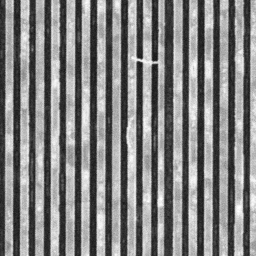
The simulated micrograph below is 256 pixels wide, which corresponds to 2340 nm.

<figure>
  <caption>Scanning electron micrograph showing parallel lines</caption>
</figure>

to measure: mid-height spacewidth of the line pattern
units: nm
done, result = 68.6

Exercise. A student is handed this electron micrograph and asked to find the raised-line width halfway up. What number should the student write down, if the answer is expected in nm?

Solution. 68.6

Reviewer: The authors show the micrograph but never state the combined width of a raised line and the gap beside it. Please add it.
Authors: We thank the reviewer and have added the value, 15.3 px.